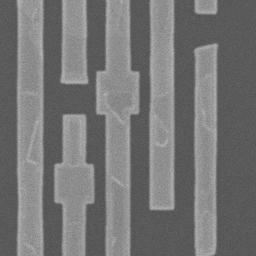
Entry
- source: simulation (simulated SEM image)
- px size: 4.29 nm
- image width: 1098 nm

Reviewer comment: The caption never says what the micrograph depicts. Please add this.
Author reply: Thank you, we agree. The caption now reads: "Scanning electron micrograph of wiring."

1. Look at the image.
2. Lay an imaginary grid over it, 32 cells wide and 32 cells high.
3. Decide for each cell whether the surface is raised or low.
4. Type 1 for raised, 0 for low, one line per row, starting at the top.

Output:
00111000111000110001110001100000
00111000111000110001110001100000
00111000111000110001110000000000
00111000111001110001110000000000
00111000111001110001100000000000
00111000111001110001100000000000
00111000111001110001100011100000
00111000111001110001110001100000
00111000111001110001110001100000
00111000111011111001110001100000
00111000000011111001110001100000
00111000000011111001110001100000
00111000000011111001110001100000
00111000000011111001110001100000
00111000000001110001110001100000
00111000111001110001110011100000
00111000111001110001110011100000
00111000111001110001110011100000
00111000110001110001110011100000
00111000110001110001110001100000
00111000111001110001110001100000
00111001111101110001110001100000
00111001111101110001110001100000
00111001111101110001110001100000
00011001111101110001110001100000
00011000111000110001110011100000
00111000111000110000000011100000
00111000110000110000000011100000
00111000110001110000000001100000
00111000110001110000000001100000
00111000110001110000000001100000
00111000110001110000000001100000